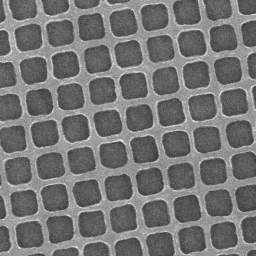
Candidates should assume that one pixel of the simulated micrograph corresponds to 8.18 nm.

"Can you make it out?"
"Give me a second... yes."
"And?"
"a regular array of holes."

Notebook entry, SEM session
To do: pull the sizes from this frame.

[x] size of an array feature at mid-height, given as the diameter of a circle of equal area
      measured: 236 nanometers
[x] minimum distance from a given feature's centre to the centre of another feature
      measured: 258 nm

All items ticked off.